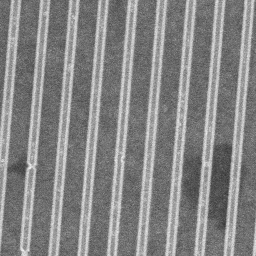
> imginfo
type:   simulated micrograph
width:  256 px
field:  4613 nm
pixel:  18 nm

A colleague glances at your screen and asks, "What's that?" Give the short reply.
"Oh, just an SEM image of parallel lines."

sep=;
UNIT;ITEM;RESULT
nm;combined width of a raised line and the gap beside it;524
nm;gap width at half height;384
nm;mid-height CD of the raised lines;139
